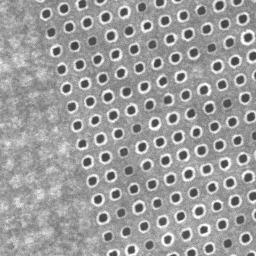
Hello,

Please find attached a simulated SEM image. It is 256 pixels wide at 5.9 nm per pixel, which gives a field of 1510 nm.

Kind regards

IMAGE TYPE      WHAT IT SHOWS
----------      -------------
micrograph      a regular array of holes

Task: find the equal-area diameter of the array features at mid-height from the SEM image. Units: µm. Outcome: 0.0545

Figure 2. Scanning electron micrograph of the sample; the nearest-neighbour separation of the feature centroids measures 110 nm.